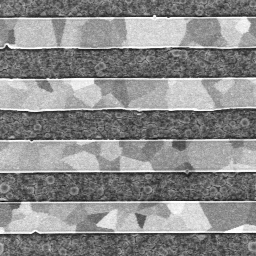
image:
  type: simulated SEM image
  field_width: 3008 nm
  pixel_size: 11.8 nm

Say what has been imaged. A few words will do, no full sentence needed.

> one or a few lines or trenches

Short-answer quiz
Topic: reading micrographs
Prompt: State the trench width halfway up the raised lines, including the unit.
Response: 364 nanometres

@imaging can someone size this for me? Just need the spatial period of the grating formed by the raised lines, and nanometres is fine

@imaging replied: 723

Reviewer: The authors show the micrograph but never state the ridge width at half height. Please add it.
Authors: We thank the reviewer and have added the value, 354 nm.